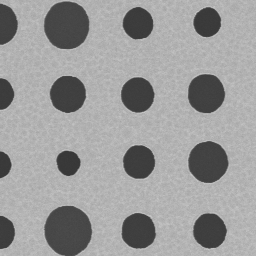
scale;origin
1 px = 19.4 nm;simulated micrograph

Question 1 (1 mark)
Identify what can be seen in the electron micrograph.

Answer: a regular array of holes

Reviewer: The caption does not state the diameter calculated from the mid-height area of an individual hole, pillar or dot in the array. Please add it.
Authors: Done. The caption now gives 672 nm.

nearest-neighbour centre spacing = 1330 nm